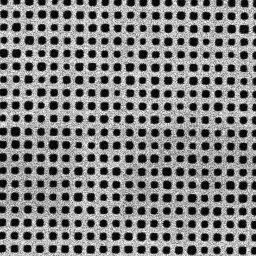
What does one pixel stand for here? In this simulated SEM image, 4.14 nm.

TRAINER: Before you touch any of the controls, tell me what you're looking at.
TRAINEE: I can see a regular array of holes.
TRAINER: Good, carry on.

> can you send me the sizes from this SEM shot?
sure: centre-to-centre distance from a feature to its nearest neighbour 0.0514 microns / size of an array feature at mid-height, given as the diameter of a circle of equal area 34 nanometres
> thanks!